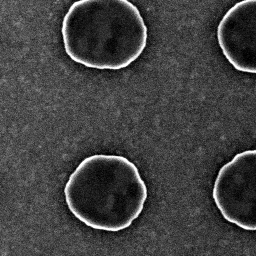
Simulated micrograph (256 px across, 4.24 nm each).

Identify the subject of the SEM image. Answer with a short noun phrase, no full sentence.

raised bodies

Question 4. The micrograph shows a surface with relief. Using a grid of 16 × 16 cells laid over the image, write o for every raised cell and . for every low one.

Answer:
.....ooo.......o
....ooooo.....oo
....ooooo.....oo
....ooooo.....oo
................
................
................
................
................
................
.....ooo......oo
....ooooo....ooo
....ooooo....ooo
.....oooo.....oo
................
................